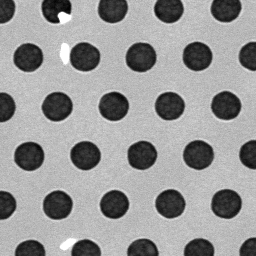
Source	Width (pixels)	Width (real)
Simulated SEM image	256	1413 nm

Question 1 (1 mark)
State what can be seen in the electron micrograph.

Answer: a regular array of holes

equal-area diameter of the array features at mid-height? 169 nanometres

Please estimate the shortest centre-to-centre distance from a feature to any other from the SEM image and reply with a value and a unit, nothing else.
310 nanometers